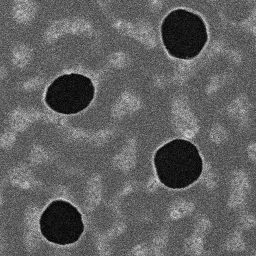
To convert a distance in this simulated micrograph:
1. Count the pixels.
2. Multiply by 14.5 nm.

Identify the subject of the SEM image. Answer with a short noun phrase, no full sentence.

holes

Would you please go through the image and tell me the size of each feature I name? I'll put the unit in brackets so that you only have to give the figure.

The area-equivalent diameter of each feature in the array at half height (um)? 0.68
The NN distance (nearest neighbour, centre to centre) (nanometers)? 1870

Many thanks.